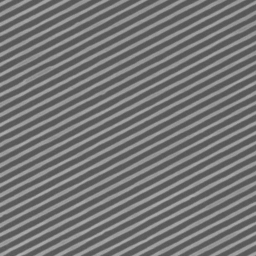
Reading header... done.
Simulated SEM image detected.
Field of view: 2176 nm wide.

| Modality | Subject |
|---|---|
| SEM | parallel lines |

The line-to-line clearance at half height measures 50 nm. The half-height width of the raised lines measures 28.3 nm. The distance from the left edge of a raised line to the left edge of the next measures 75.7 nanometres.